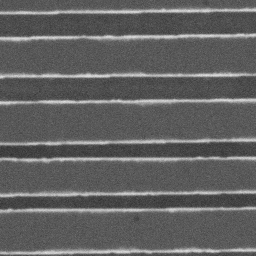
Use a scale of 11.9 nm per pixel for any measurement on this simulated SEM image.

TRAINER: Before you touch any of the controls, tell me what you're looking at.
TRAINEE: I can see lines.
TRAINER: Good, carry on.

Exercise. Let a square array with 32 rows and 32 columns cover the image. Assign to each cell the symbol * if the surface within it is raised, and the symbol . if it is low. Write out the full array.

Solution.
********************************
*****************...............
................................
................................
......................**********
********************************
********************************
********************************
********************************
**********.**...................
................................
................................
...........................***.*
********************************
********************************
********************************
********************************
******************************..
................................
................................
********************************
********************************
********************************
********************************
................................
................................
********************************
********************************
********************************
********************************
********************************
*************...................